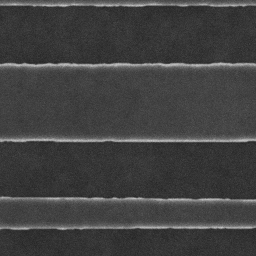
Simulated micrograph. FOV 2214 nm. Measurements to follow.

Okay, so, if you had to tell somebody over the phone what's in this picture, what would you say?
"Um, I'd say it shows lines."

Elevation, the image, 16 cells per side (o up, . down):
................
................
................
................
oooooooooooooooo
oooooooooooooooo
oooooooooooooooo
oooooooooooooooo
oooooooooooooooo
................
................
................
ooooooooooooooo.
oooooooooooooooo
................
................